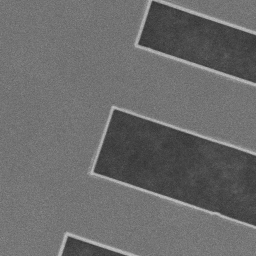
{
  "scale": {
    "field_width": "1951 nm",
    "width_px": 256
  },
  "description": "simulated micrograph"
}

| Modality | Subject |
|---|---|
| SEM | one or a few lines or trenches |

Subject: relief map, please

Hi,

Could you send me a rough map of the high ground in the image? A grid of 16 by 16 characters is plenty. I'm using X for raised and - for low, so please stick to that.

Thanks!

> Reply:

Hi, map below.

XXXXXXXXX--XXXXX
XXXXXXXXX-----XX
XXXXXXXXX-------
XXXXXXXXXXX-----
XXXXXXXXXXXXXX--
XXXXXXXXXXXXXXXX
XXXXXXXXXXXXXXXX
XXXXXXX--XXXXXXX
XXXXXX------XXXX
XXXXXX----------
XXXXXX----------
XXXXXXXX--------
XXXXXXXXXXX-----
XXXXXXXXXXXXXX--
XXXXXXXXXXXXXXXX
XXXX---XXXXXXXXX